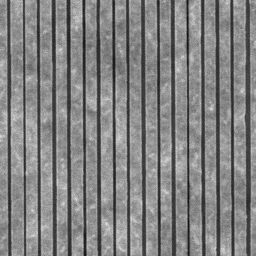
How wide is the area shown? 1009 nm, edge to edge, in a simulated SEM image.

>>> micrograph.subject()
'parallel lines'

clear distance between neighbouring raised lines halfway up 15.3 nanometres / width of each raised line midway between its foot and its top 43.3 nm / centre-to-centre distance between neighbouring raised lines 58.4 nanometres